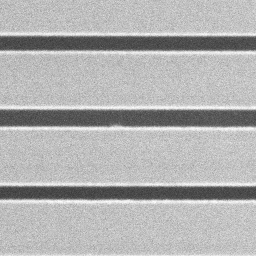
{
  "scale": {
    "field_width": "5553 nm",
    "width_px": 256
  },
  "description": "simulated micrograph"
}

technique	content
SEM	lines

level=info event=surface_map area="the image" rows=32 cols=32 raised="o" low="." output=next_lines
oooooooooooooooooooooooooooooooo
oooooooooooooooooooooooooooooooo
oooooooooooooooooooooooooooooooo
oooooooooooooooooooooooooooooooo
................................
................................
oooooooooooooooooooooooooooooooo
oooooooooooooooooooooooooooooooo
oooooooooooooooooooooooooooooooo
oooooooooooooooooooooooooooooooo
oooooooooooooooooooooooooooooooo
oooooooooooooooooooooooooooooooo
oooooooooooooooooooooooooooooooo
oooooooooooooooooooooooooooooooo
................................
................................
oooooooooooooooooooooooooooooooo
oooooooooooooooooooooooooooooooo
oooooooooooooooooooooooooooooooo
oooooooooooooooooooooooooooooooo
oooooooooooooooooooooooooooooooo
oooooooooooooooooooooooooooooooo
oooooooooooooooooooooooooooooooo
................................
................................
oooooooooooooooooooooooooooooooo
oooooooooooooooooooooooooooooooo
oooooooooooooooooooooooooooooooo
oooooooooooooooooooooooooooooooo
oooooooooooooooooooooooooooooooo
oooooooooooooooooooooooooooooooo
oooooooooooooooooooooooooooooooo